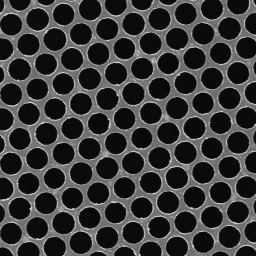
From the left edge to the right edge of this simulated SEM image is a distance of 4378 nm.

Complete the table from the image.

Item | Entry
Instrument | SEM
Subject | a regular array of holes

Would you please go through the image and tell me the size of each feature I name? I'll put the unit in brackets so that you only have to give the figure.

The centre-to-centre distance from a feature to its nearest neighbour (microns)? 0.447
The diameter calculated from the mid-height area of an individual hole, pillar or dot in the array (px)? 21.8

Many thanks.